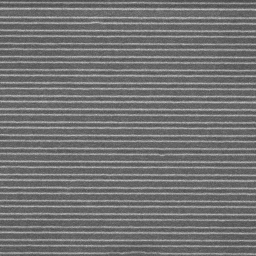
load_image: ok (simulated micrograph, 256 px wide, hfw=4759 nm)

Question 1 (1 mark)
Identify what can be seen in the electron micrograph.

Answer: parallel lines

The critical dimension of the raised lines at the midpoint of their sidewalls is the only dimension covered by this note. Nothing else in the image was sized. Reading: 109 nanometres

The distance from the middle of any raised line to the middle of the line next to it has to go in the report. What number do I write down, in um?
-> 0.245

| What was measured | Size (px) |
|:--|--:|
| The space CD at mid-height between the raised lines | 6.75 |